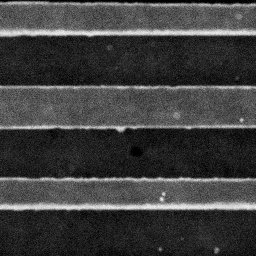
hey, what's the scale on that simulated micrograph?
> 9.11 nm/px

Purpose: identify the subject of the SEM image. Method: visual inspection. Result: lines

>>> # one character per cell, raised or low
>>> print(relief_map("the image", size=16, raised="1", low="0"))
1111111111111111
1111111111111111
0000000000000000
0000000000000000
0000000000000000
1111111111111111
1111111111111111
1111111111111111
0000000000000000
0000000000000000
0000000000000000
1111111111111111
1111111111111111
0000000000000000
0000000000000000
0000000000000000